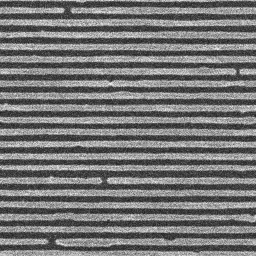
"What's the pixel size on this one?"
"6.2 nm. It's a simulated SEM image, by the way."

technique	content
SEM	parallel lines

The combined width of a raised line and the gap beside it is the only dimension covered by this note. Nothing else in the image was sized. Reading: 75.5 nm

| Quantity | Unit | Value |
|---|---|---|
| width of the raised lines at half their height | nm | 33.3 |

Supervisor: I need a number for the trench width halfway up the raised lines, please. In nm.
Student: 39.5